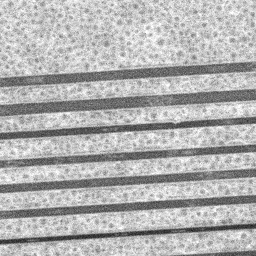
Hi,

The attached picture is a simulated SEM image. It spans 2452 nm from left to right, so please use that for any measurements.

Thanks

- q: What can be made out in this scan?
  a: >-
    parallel lines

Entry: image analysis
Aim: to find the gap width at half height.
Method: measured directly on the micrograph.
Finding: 88.4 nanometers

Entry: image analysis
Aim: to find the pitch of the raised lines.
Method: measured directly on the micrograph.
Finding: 26.6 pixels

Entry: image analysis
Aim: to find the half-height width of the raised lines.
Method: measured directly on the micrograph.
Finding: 160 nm